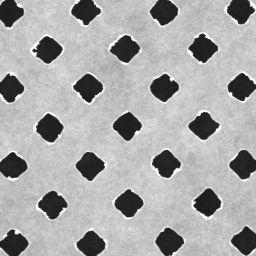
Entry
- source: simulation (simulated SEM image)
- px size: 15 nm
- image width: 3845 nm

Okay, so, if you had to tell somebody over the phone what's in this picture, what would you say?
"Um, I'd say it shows a regular array of holes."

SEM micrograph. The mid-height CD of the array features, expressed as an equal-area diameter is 386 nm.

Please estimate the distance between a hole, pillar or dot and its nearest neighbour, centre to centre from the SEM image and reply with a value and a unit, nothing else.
810 nm